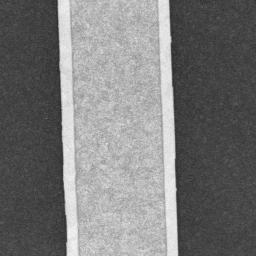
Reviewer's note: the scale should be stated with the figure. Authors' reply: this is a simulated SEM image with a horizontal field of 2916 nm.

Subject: one or a few lines or trenches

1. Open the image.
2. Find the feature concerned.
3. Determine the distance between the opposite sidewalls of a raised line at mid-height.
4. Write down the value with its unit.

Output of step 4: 100 pixels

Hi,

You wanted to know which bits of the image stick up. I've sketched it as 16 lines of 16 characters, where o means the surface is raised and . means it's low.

....oooooo......
....oooooo......
....oooooo......
....oooooo......
....oooooo......
....oooooo......
....oooooo......
....ooooooo.....
....ooooooo.....
....ooooooo.....
....ooooooo.....
....ooooooo.....
....ooooooo.....
.....oooooo.....
.....oooooo.....
.....oooooo.....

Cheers